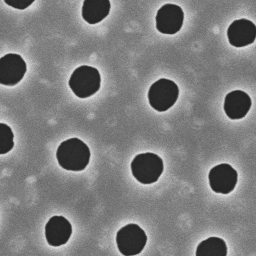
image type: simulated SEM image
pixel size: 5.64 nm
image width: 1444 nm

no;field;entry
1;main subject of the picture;a regular array of holes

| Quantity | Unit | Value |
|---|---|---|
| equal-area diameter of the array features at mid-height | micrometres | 0.173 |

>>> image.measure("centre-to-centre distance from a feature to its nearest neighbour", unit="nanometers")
422